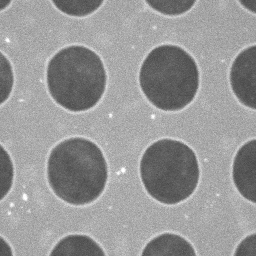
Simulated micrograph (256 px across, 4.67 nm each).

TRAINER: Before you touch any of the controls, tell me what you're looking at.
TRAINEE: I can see holes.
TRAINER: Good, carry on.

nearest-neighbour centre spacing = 0.431 micrometres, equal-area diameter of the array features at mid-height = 289 nanometers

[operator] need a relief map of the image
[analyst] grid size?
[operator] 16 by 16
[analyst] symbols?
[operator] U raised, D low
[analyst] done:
UUUUDDUUUUDDUUUD
UUUUUUUUUUUUUUUU
UUUUUUUUUUUUUUUU
UUUDDDUUUDDDUUUD
DUUDDDDUUDDDUUDD
DUUDDDDUUDDDUUUD
UUUUDDUUUUDDUUUD
UUUUUUUUUUUUUUUU
UUUUUUUUUUUUUUUU
UUUDDDUUUDDDUUUD
DUUDDDDUUDDDUUUD
DUUDDDDUUDDDUUUD
UUUUDDUUUUDUUUUU
UUUUUUUUUUUUUUUU
UUUUUUUUUUUUUUUU
DUUDDDUUUDDDUUUD